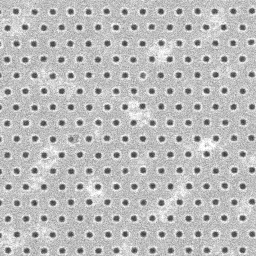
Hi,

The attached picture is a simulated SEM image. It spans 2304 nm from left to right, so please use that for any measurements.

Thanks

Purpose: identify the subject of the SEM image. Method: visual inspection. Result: a regular array of holes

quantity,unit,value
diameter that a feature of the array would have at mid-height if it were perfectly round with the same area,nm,63.4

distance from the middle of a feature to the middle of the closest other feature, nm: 158